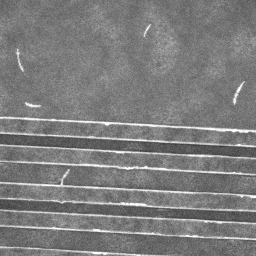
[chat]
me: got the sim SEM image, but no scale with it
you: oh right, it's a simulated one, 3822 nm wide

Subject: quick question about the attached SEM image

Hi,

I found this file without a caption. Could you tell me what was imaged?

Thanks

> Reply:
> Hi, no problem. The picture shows parallel lines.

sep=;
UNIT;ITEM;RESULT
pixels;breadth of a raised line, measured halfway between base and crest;16.2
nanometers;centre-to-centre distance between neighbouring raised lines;461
